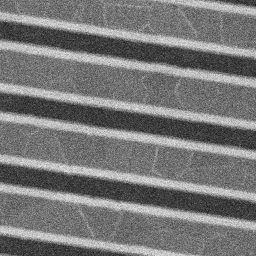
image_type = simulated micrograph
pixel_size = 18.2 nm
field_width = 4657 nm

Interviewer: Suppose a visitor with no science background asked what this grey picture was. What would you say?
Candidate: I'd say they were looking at one or a few lines or trenches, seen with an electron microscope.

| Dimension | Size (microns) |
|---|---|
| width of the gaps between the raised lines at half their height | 0.519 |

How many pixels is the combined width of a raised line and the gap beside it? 70.6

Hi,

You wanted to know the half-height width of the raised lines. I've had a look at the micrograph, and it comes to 755 nanometres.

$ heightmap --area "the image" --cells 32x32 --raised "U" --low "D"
UUUUUUUUUUUUUUUUUUUUUUUUUDDDDDDD
UUUUUUUUUUUUUUUUUUUUUUUUUUUUUUUU
DDDDUUUUUUUUUUUUUUUUUUUUUUUUUUUU
DDDDDDDDDDDUUUUUUUUUUUUUUUUUUUUU
DDDDDDDDDDDDDDDDDUUUUUUUUUUUUUUU
DDDDDDDDDDDDDDDDDDDDDDDDUUUUUUUU
UUUUUUDDDDDDDDDDDDDDDDDDDDDDDDUU
UUUUUUUUUUUUDDDDDDDDDDDDDDDDDDDD
UUUUUUUUUUUUUUUUUUUUDDDDDDDDDDDD
UUUUUUUUUUUUUUUUUUUUUUUUUUDDDDDD
UUUUUUUUUUUUUUUUUUUUUUUUUUUUUUUU
DDDDUUUUUUUUUUUUUUUUUUUUUUUUUUUU
DDDDDDDDDDUUUUUUUUUUUUUUUUUUUUUU
DDDDDDDDDDDDDDDDDDUUUUUUUUUUUUUU
DDDDDDDDDDDDDDDDDDDDDDDDUUUUUUUU
UUUUUUDDDDDDDDDDDDDDDDDDDDDDDDDU
UUUUUUUUUUUUUDDDDDDDDDDDDDDDDDDD
UUUUUUUUUUUUUUUUUUUDDDDDDDDDDDDD
UUUUUUUUUUUUUUUUUUUUUUUUUUDDDDDD
UUUUUUUUUUUUUUUUUUUUUUUUUUUUUUUU
DDDDDUUUUUUUUUUUUUUUUUUUUUUUUUUU
DDDDDDDDDDDUUUUUUUUUUUUUUUUUUUUU
DDDDDDDDDDDDDDDDDDUUUUUUUUUUUUUU
DDDDDDDDDDDDDDDDDDDDDDDDUUUUUUUU
UUUUUUUDDDDDDDDDDDDDDDDDDDDDDDDU
UUUUUUUUUUUUUUDDDDDDDDDDDDDDDDDD
UUUUUUUUUUUUUUUUUUUUDDDDDDDDDDDD
UUUUUUUUUUUUUUUUUUUUUUUUUUUDDDDD
UUUUUUUUUUUUUUUUUUUUUUUUUUUUUUUU
DDDDDUUUUUUUUUUUUUUUUUUUUUUUUUUU
DDDDDDDDDDDDUUUUUUUUUUUUUUUUUUUU
DDDDDDDDDDDDDDDDDDDUUUUUUUUUUUUU